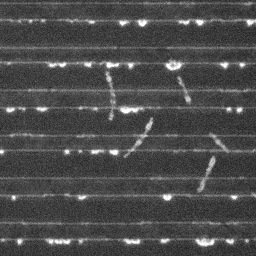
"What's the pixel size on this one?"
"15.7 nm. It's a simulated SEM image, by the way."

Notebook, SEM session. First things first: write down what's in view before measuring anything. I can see lines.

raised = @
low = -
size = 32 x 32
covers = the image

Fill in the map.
@@@@@@@@@@@@@@@@@@@@@@@@@@@@@@@@
@@@@@@@@@@@@@@@@@@@@@@@@@@@@@@@@
-@@-----@@@@@@@@@@@@@@@@@@@@@@@@
--------------------------------
--------------------------------
--------------------------------
@@@@@@@@@@@@@@@@@@@@@@@@@@@@@@@@
@@@@@@@@@@@@@@@@@@@@@@@@@@@@@@@@
---------------------@----------
--------------------------------
--------------------------------
@@@@@@@@@@@@@@@@@@@@@@@@@@@@@@@@
@@@@@@@@@@@@@@@@@@@@@@@@@@@@@@@@
@@--@@-------@@@@@----------@@@-
--------------------------------
--------------------------------
--------------------------------
@@@@@@@@@@@@@@@@@@@@@@@@@@@@@@@@
@@@@@@@@@@@@@@@@@@@@@@@@@@@@@@@@
--------------------------------
--------------------------------
--------------------------------
@@@@@@@@@@@@@@@@@@@@@@@@@@@@@@@@
@@@@@@@@@@@@@@@@@@@@@@@@@@@@@@@@
-@-------@@---------@--------@-@
--------------------------------
--------------------------------
--------------------------------
@@@@@@@@@@@@@@@@@@@@@@@@@@@@@@@@
@@@@@@@@@@@@@@@@@@@@@@@@@@@@@@@@
-------------------------@------
--------------------------------